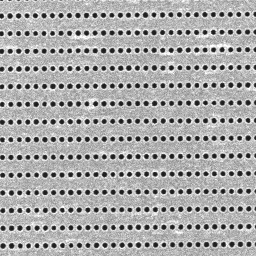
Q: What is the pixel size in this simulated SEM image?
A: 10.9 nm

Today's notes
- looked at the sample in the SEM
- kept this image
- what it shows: a regular array of holes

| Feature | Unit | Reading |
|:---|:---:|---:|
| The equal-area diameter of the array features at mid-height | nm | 56.6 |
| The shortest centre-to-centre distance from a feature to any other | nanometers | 89.8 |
